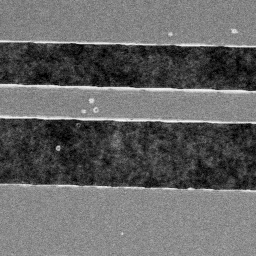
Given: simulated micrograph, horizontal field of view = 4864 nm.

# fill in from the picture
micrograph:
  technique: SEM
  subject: lines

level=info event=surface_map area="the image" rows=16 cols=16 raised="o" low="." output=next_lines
oooooooooooooooo
oooooooooooooooo
oooooooooooooooo
................
................
oooooooo........
oooooooooooooooo
.......ooooooooo
................
................
................
................
oooooooooooooooo
oooooooooooooooo
oooooooooooooooo
oooooooooooooooo